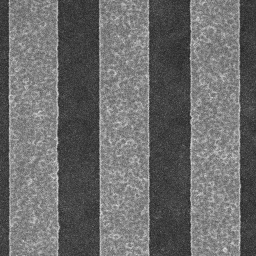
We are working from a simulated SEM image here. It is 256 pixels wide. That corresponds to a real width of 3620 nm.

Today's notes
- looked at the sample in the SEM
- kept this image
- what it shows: one or a few lines or trenches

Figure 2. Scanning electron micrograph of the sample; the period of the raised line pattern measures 1290 nm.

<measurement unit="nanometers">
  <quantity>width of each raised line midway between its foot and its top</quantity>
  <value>682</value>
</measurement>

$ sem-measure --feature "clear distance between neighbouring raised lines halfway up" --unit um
0.599